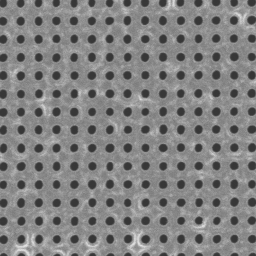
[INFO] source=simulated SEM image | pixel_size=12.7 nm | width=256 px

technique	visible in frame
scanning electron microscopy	a regular array of holes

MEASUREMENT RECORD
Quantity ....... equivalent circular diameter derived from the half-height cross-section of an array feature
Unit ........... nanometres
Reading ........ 113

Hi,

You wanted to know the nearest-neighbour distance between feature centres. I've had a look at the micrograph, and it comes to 0.225 um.